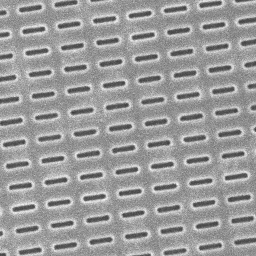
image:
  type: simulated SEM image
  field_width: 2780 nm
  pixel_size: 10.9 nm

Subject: a regular array of holes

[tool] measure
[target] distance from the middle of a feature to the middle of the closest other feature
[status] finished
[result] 235 nm